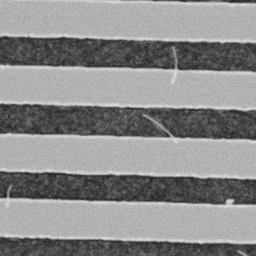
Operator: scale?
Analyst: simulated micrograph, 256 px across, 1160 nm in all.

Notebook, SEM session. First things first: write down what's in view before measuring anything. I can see lines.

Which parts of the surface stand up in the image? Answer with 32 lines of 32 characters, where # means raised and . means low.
################################
################################
################################
################################
################################
................................
................................
................................
###########.....................
################################
################################
################################
################################
..........................######
................................
................................
................................
################################
################################
################################
################################
....############################
................................
................................
................................
########################........
################################
################################
################################
################################
................................
................................